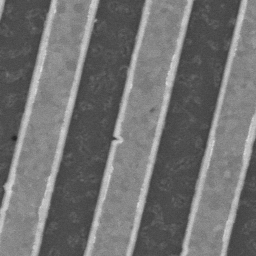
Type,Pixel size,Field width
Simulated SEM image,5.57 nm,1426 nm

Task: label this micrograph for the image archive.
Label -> one or a few lines or trenches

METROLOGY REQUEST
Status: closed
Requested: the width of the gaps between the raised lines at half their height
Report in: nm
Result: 293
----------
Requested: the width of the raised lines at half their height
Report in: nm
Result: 222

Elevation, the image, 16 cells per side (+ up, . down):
...+++...+++...+
...+++...+++...+
...++....++....+
...++...+++...++
..+++...+++...++
..+++...+++...++
..++....++....++
..++...+++...+++
.+++...+++...+++
.+++...+++...+++
.++....++....++.
.++....++....++.
+++...+++...+++.
+++...+++...++..
++....++....++..
++....++....++..